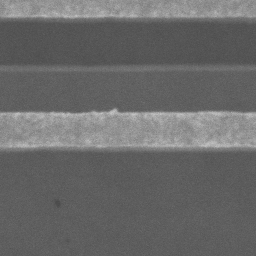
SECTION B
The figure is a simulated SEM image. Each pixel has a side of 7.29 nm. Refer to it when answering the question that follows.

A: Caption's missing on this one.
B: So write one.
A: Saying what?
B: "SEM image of lines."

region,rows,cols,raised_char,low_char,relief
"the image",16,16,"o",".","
oooooooooooooooo
................
................
................
oooooooooooooooo
oooooooooooooooo
oooooooooooooooo
oooooooooooooooo
oooooooooooooooo
................
................
................
................
................
................
................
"